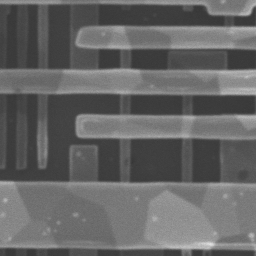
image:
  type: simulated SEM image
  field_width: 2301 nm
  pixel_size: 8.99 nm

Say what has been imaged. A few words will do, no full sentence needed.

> wiring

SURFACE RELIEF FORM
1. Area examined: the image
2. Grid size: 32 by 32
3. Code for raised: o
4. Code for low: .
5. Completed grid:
....................oooooooooooo
..........................ooooo.
................................
..........oooooooooooooooooooooo
..........oooooooooooooooooooooo
..........oooooooooooooooooooooo
................................
................................
................................
oooooooooooooooooooooooooooooooo
oooooooooooooooooooooooooooooooo
oooooooooooooooooooooooooooooooo
................................
................................
..........ooooooooo........ooo..
.........ooooooooooooooooooooooo
.........ooooooooooooooooooooooo
................................
................................
................................
................................
................................
................................
oooooooooooooooooooooooooooooooo
oooooooooooooooooooooooooooooooo
oooooooooooooooooooooooooooooooo
oooooooooooooooooooooooooooooooo
oooooooooooooooooooooooooooooooo
oooooooooooooooooooooooooooooooo
oooooooooooooooooooooooooooooooo
oooooooooooooooooooooooooooooooo
................................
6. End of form